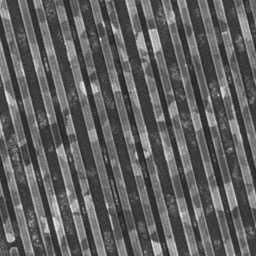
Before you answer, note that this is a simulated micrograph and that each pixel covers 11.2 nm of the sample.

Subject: parallel lines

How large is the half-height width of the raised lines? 88.6 nanometres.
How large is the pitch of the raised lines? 196 nm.